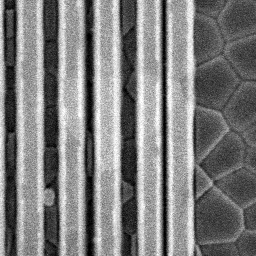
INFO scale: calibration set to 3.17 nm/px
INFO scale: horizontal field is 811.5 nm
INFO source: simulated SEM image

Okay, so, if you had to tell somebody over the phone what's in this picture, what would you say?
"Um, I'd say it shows parallel lines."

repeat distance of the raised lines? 118 nanometres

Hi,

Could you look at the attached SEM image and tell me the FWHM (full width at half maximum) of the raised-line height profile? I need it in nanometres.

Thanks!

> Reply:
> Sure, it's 70.1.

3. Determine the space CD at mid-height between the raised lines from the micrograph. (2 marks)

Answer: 51.1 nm